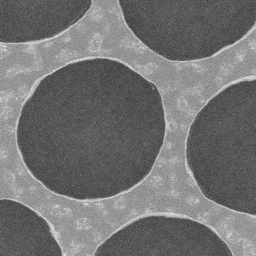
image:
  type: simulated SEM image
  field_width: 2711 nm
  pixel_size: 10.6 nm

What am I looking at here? holes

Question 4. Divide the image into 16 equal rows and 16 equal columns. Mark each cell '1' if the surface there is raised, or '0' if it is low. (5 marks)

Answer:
0000001100000000
0000011100000000
0001111110000001
1111111111000111
1110000011111111
1100000000111100
1100000000111000
1000000000110000
1000000000110000
1000000000110000
1100000000110000
1110000001110000
0111111111111000
0001111110011111
0001111000000111
0000110000000011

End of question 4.